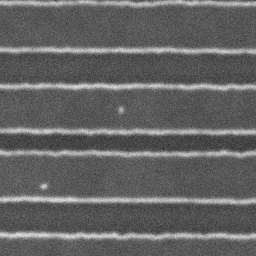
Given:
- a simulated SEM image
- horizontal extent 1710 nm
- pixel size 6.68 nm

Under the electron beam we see lines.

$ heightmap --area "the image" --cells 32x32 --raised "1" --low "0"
11111111111111111111111111111111
11111111111111111111111111111111
11111111111111111111111111111111
11111111111111111111111111111111
11111111111111111111111111111111
11111111111111111111111111111111
00000000000000000000000110011101
00000000000000000000000000000000
00000000000000000000000000000000
00000000000000000000000000000000
00000000000000000000000000000000
11111111111111111111111111111111
11111111111111111111111111111111
11111111111111111111111111111111
11111111111111111111111111111111
11111111111111111111111111111111
00001110111111111111111111111111
00000000000000000000000000000000
00000000000000000000000000000000
11111111111111111111111111111111
11111111111111111111111111111111
11111111111111111111111111111111
11111111111111111111111111111111
11111111111111111111111111111111
11111111111111111111111111111111
00000000000000000000000000000000
00000000000000000000000000000000
00000000000000000000000000000000
00000000000000000000000000000000
11111111111111101110111110111101
11111111111111111111111111111111
11111111111111111111111111111111